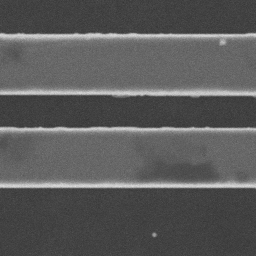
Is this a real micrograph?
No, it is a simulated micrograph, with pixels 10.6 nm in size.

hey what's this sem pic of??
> lines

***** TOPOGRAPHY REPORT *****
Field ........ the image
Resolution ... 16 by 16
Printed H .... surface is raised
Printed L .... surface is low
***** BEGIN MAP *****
LLLLLLLLLLLLLLLL
LLLLLLLLLLLLLLLL
HHHHHHHHHHHHHHHH
HHHHHHHHHHHHHHHH
HHHHHHHHHHHHHHHH
HHHHHHHHHHHHHHHH
LLLLLLLLLLLLLLLL
LLLLLLLLLLLLLLLL
HHHHHHHHHHHHHHHH
HHHHHHHHHHHHHHHH
HHHHHHHHHHHHHHHH
HHHHHHHHHHHHHHHH
LLLLLLLLLLLLLLLL
LLLLLLLLLLLLLLLL
LLLLLLLLLLLLLLLL
LLLLLLLLLLLLLLLL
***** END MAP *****